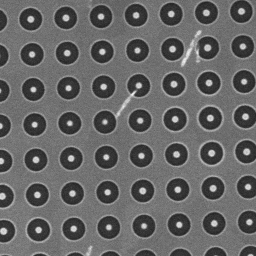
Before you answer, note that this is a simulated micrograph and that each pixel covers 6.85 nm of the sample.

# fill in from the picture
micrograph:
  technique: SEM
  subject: an array of small figures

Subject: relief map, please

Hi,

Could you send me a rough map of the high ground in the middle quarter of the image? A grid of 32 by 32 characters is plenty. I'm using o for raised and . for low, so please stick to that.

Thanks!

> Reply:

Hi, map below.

oooooooooooooooooooooooooooooooo
oooooooooooooooooooooooooooooooo
oooooooooooooooooo.ooooooo...ooo
...ooooo....oooo.....oooo.....oo
....ooo......ooo.....ooo...o..oo
....ooo..o...ooo..o...ooo..o...o
....ooo......ooo.....oooo.....oo
....oooo....oooooo...ooooo...ooo
...oooooo..ooooooooooooooooooooo
oooooooooooooooooooooooooooooooo
oooooooooooooooooooooooooooooooo
oooooooooooooooooo..oooooo....oo
...ooooo....ooooo....oooo......o
....ooo......ooo......ooo..o...o
.o..ooo...o..ooo......ooo......o
....oooo.....ooo......ooo.....oo
....oooo....ooooo....oooooo..ooo
o..ooooooo.ooooooooooooooooooooo
oooooooooooooooooooooooooooooooo
oooooooooooooooooooooooooooooooo
oooooooooo.ooooooo...ooooo....oo
....oooo.....oooo.....ooo......o
....oooo.....ooo...o..ooo..oo..o
.o...ooo..o...oo...o..ooo......o
.....ooo.....oooo.....oooo....oo
....ooooo....ooooo...ooooooo.ooo
o.oooooooooooooooooooooooooooooo
oooooooooooooooooooooooooooooooo
oooooooooooooooooooooooooooo.ooo
oo.oooooo...oooooo....oooo.....o
....ooooo....oooo.....oooo.....o
.....ooo......ooo..o...ooo..o..o